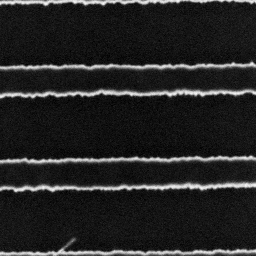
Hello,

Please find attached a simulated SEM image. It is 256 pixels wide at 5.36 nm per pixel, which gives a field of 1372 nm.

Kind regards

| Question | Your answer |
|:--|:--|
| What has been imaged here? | lines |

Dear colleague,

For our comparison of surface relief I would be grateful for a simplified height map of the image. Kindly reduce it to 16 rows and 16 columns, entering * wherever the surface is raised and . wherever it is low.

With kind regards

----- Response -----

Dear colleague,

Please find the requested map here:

................
................
................
................
****************
****************
................
................
................
................
****************
****************
................
................
................
................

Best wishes